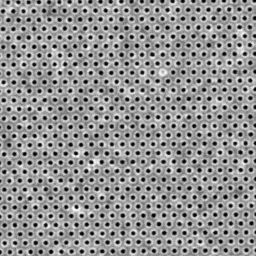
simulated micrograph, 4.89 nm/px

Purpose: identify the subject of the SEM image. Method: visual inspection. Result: a regular array of holes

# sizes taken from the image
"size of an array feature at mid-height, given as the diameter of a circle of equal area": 25.9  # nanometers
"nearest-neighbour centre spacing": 0.048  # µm